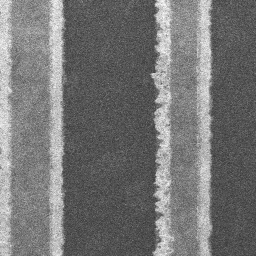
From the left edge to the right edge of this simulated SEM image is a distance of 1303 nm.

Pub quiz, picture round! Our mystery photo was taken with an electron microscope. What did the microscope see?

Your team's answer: one or a few lines or trenches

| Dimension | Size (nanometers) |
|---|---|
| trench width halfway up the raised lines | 534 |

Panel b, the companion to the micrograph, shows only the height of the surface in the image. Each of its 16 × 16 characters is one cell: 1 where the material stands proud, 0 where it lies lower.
1111000000111000
1111000000111000
1111000000111000
1111000000111000
1111000000111000
1111000000111000
1111000000111000
1111000000111000
1111000000111000
1111000000111000
1111000000111000
1111000000111000
1111000000111000
1111000000111000
1111000000111000
1111000000111000